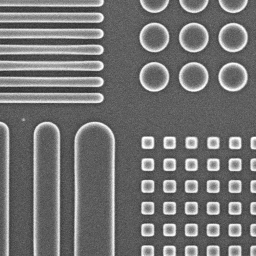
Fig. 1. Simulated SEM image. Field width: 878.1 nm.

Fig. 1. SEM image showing groups of lines, slits or small figures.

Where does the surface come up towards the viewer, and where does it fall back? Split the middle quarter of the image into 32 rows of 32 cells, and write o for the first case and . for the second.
oooooooooo..........ooooo.....oo
...................ooooooo...ooo
...................ooooooo...ooo
......ooo..........ooooooo...ooo
oooooooooo.........ooooooo...ooo
...oooooo...........ooooo.....oo
.....................ooo.......o
ooo.............................
oooooooooo......................
ooooooooo.......................
................................
................................
................................
................................
................................
.....oooooo.....................
....oooooooo....................
...ooooooooo....................
...ooooooooo........oo..........
...oooooooooo.......oo...ooo...o
...oooooooooo.......oo...ooo...o
...oooooooooo...................
...oooooooooo...................
...ooooooooo....................
...ooooooooo........oo...ooo...o
...ooooooooo........oo...ooo...o
...ooooooooo........oo...ooo...o
...ooooooooo....................
...ooooooooo....................
...ooooooooo........oo...ooo...o
...ooooooooo........oo...ooo..oo
...ooooooooo........oo...ooo..oo